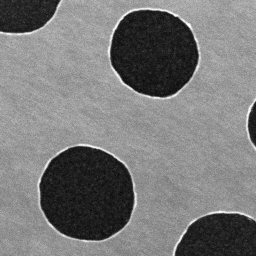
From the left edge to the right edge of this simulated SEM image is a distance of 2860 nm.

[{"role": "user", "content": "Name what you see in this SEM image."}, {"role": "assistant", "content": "holes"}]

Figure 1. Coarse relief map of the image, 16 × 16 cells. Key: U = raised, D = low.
DDDDUUUUUUUUUUUU
DDDUUUUDDDDDUUUU
UUUUUUUDDDDDUUUU
UUUUUUUDDDDDUUUU
UUUUUUUDDDDDUUUU
UUUUUUUUDDDUUUUU
UUUUUUUUUUUUUUUU
UUUUUUUUUUUUUUUU
UUUUUUUUUUUUUUUU
UUUUDDDUUUUUUUUU
UUUDDDDDUUUUUUUU
UUDDDDDDUUUUUUUU
UUUDDDDDUUUUUUUU
UUUDDDDDUUUUUDDU
UUUUDDDUUUUUDDDD
UUUUUUUUUUUDDDDD